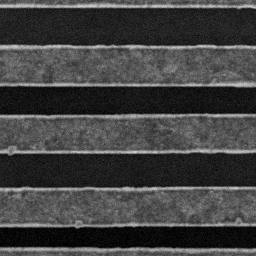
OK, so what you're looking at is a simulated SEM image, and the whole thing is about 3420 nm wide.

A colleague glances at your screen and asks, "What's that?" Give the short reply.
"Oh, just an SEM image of lines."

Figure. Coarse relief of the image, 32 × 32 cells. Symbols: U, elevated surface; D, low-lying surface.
UUUUUUUUUUUUUUUUUUUUUUUUUUUUUUUU
DDDDDDDDDDDDDDDDDDDDDDDDDDDDDDDD
DDDDDDDDDDDDDDDDDDDDDDDDDDDDDDDD
DDDDDDDDDDDDDDDDDDDDDDDDDDDDDDDD
DDDDDDDDDDDDDDDDDDDDDDDDDDDDDDDD
DDDDDDDDDDDDDDDDDDDDDDDDDDDDDDDD
UUUUUUUUUUUUUUUUUUUUUUUUUUUUUUUU
UUUUUUUUUUUUUUUUUUUUUUUUUUUUUUUU
UUUUUUUUUUUUUUUUUUUUUUUUUUUUUUUU
UUUUUUUUUUUUUUUUUUUUUUUUUUUUUUUU
UUUUUUUUUUUUUUUUUUUUUUUUUUUUUUUU
DDDDDDDDDDDDDDDDDDDDDDDDDDDDDDDD
DDDDDDDDDDDDDDDDDDDDDDDDDDDDDDDD
DDDDDDDDDDDDDDDDDDDDDDDDDDDDDDDD
UUUUUDUUUUUUUUUUUUUUUUUUUUUUUUUU
UUUUUUUUUUUUUUUUUUUUUUUUUUUUUUUU
UUUUUUUUUUUUUUUUUUUUUUUUUUUUUUUU
UUUUUUUUUUUUUUUUUUUUUUUUUUUUUUUU
UUUUUUUUUUUUUUUUUUUUUUUUUUUUUUUU
DDDDDDDDDDDDDDDDDDDDDDDDDDDDDDDD
DDDDDDDDDDDDDDDDDDDDDDDDDDDDDDDD
DDDDDDDDDDDDDDDDDDDDDDDDDDDDDDDD
DDDDDDDDDDDDDDDDDDDDDDDDDDDDDDDD
DDDDDDDDDDDDDDDDDDDDUUUUUUUUUUUU
UUUUUUUUUUUUUUUUUUUUUUUUUUUUUUUU
UUUUUUUUUUUUUUUUUUUUUUUUUUUUUUUU
UUUUUUUUUUUUUUUUUUUUUUUUUUUUUUUU
UUUUUUUUUUUUUUUUUUUUUUUUUUUUUUUU
DDDDDDDDDDDDDDDDDDDDDDDDDDDDDDDD
DDDDDDDDDDDDDDDDDDDDDDDDDDDDDDDD
DDDDDDDDDDDDDDDDDDDDDDDDDDDDDDDD
UUUUUUUUUUUUUUUUUUUUUUUUUUUUUUUU